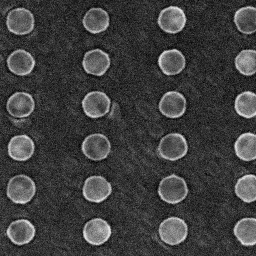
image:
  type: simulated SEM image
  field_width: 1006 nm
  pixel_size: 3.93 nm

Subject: a regular array of raised bodies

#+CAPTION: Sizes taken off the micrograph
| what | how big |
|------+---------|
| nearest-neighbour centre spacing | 0.166 microns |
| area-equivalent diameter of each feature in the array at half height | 0.103 µm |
